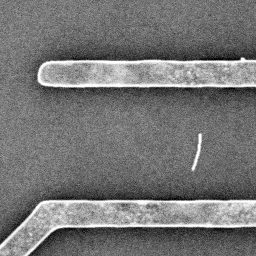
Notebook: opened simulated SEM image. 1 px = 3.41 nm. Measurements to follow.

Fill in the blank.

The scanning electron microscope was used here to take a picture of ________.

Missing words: wiring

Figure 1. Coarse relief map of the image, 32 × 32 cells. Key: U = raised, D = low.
DDDDDDDDDDDDDDDDDDDDDDDDDDDDDDDD
DDDDDDDDDDDDDDDDDDDDDDDDDDDDDDDD
DDDDDDDDDDDDDDDDDDDDDDDDDDDDDDDD
DDDDDDDDDDDDDDDDDDDDDDDDDDDDDDDD
DDDDDDDDDDDDDDDDDDDDDDDDDDDDDDDD
DDDDDDDDDDDDDDDDDDDDDDDDDDDDDDDD
DDDDDDDDDDDDDDDDDDDDDDDDDDDDDDDD
DDDDDDDDDDDDDDDDDDDDDDDDDDDDDDDD
DDDDDUUUUUUUUUUUUUUUUUUUUUUUUUUU
DDDDDUUUUUUUUUUUUUUUUUUUUUUUUUUU
DDDDDUUUUUUUUUUUUUUUUUUUUUUUUUUU
DDDDDDDDDDDDDDDDDDDDDDDDDDDDDDDD
DDDDDDDDDDDDDDDDDDDDDDDDDDDDDDDD
DDDDDDDDDDDDDDDDDDDDDDDDDDDDDDDD
DDDDDDDDDDDDDDDDDDDDDDDDDDDDDDDD
DDDDDDDDDDDDDDDDDDDDDDDDDDDDDDDD
DDDDDDDDDDDDDDDDDDDDDDDDDDDDDDDD
DDDDDDDDDDDDDDDDDDDDDDDDDDDDDDDD
DDDDDDDDDDDDDDDDDDDDDDDDDDDDDDDD
DDDDDDDDDDDDDDDDDDDDDDDDDDDDDDDD
DDDDDDDDDDDDDDDDDDDDDDDDDDDDDDDD
DDDDDDDDDDDDDDDDDDDDDDDDDDDDDDDD
DDDDDDDDDDDDDDDDDDDDDDDDDDDDDDDD
DDDDDDDDDDDDDDDDDDDDDDDDDDDDDDDD
DDDDDDDDDDDDDDDDDDDDDDDDDDDDDDDD
DDDDDUUUUUUUUUUUUUUUUUUUUUUUUUUU
DDDDUUUUUUUUUUUUUUUUUUUUUUUUUUUU
DDDUUUUUUUUUUUUUUUUUUUUUUUUUUUUU
DDUUUUUDDDDDDDDDDDDDDDDDDDDDDDDD
DUUUUUDDDDDDDDDDDDDDDDDDDDDDDDDD
UUUUUDDDDDDDDDDDDDDDDDDDDDDDDDDD
UUUUDDDDDDDDDDDDDDDDDDDDDDDDDDDD